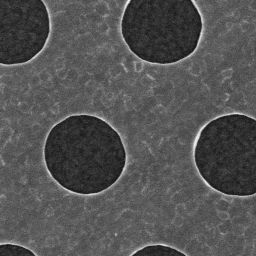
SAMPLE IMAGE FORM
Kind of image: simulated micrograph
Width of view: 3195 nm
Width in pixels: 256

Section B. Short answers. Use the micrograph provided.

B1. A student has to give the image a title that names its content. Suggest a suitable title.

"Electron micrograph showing holes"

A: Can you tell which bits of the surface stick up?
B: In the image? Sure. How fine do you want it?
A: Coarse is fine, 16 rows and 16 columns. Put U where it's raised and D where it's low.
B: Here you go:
DDDUUUUUDDDDUUUU
DDDUUUUUDDDDDUUU
DDDUUUUUDDDDUUUU
DDUUUUUUUDDDUUUU
UUUUUUUUUUUUUUUU
UUUUUUUUUUUUUUUU
UUUUUUUUUUUUUUUU
UUUUDDUUUUUUUDDD
UUUDDDDUUUUUDDDD
UUUDDDDDUUUUDDDD
UUUDDDDDUUUUDDDD
UUUUDDDUUUUUUDDD
UUUUUUUUUUUUUUUU
UUUUUUUUUUUUUUUU
UUUUUUUUUUUUUUUU
DDUUUUUUUDDUUUUU